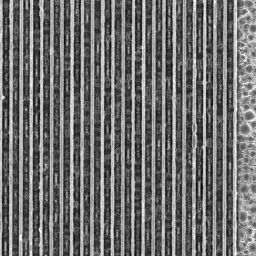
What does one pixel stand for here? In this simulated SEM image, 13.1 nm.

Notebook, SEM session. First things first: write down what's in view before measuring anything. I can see parallel lines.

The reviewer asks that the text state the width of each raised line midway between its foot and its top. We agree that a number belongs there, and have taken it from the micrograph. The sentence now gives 37.5 nanometres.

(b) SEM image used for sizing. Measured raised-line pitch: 133 nanometers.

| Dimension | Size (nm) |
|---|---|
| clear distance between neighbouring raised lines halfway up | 103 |